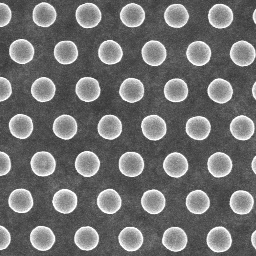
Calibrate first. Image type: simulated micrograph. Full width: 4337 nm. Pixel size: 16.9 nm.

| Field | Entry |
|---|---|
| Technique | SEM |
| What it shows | a regular array of raised bodies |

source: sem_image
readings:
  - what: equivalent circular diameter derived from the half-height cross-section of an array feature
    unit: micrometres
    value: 0.41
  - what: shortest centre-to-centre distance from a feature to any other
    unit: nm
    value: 728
